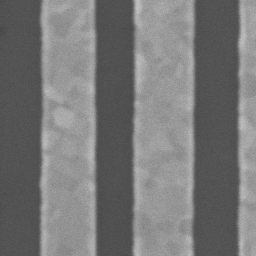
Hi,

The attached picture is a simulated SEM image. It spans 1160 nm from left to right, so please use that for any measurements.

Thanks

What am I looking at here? lines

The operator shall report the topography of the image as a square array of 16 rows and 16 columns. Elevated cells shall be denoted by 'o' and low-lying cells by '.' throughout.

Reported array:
...ooo..oooo...o
...ooo..oooo...o
...ooo..oooo...o
...ooo..oooo...o
...ooo..oooo...o
...ooo..oooo...o
...ooo..oooo...o
...ooo..oooo...o
...ooo..oooo...o
...ooo..oooo...o
...ooo..oooo...o
...ooo..oooo...o
...ooo..oooo...o
...ooo..oooo...o
...ooo..oooo...o
...ooo..oooo...o